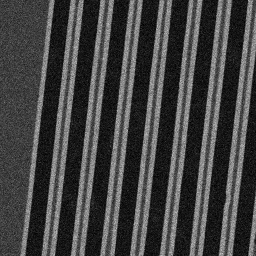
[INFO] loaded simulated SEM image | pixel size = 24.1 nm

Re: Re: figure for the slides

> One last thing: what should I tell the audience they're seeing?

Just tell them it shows parallel lines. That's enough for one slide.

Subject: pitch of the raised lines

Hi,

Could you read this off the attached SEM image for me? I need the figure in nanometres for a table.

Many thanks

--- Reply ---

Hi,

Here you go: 707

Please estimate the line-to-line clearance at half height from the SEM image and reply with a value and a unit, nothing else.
487 nm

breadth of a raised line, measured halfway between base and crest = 209 nm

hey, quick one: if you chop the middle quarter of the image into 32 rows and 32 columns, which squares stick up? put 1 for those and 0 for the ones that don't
11100000110000011000000110000011
11000000110000011000001110000011
11000000110000011000001110000011
11000001110000011000001100000111
11000001110000011000001100000111
11000001100000111000001100000110
11000001100000111000001100000110
11000001100000110000001100000110
11000001100000110000001100000110
11000001100000110000011100000110
10000001100000110000011100000110
10000001100000110000011000000110
10000011100000110000011000000110
10000011100000110000011000001110
10000011000001110000011000001110
10000011000001110000011000001110
10000011000001100000011000001100
10000011000001100000011000001100
10000011000001100000111000001100
00000011000001100000111000001100
00000011000001100000110000001100
00000111000001100000110000001100
00000111000001100000110000011100
00000110000011100000110000011100
00000110000011100000110000011000
00000110000011000000110000011000
00000110000011000000110000011000
00000110000011000001110000011000
00000110000011000001110000011000
00001110000011000001100000011000
00001110000011000001100000011000
00001100000111000001100000111000